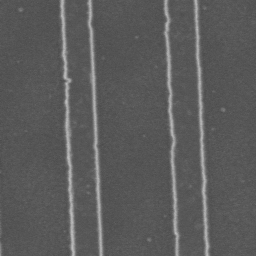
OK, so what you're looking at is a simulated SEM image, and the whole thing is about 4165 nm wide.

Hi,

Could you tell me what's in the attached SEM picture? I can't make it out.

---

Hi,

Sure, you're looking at one or a few lines or trenches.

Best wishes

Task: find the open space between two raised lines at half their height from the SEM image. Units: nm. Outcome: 1220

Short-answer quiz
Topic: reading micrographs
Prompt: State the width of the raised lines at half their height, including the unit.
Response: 478 nm